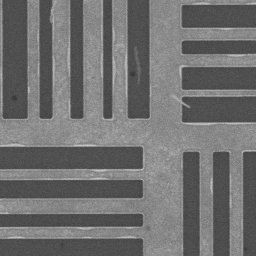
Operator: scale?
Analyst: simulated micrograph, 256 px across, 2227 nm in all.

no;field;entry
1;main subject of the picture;groups of lines, slits or small figures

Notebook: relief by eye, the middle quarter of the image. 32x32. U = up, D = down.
UDDDDUUUUDDDDUUUDDDDDDUUUUUUUUUU
UDDDDUUUUDDDDUUUDDDDDDUUUUUUUDDD
UDDDDUUUUDDDDUUUDDDDDDUUUUUUUDDD
UDDDDUUUUUDDUUUUDDDDDDUUUUUUUDDD
UDDDDUUUUUDDUUUUDDDDDDUUUUUUUDDD
UDDDDUUUUUDDUUUUDDDDDDUUUUUUUDDD
UDDDDUUUUUDDUUUUDDDDDDUUUUUUUUDD
UDDDDUUUUUDDUUUUDDDDDDUUUUUUUUUU
UDDDDUUUUUDDUUUUDDDDDDUUUUUUUDDD
UDDDDUUUUUDDUUUUDDDDDDUUUUUUUUDD
UDDDDUUUUUDDUUUUDDDDDDUUUUUUUDDD
UDDDDUUUUUDDUUUUDDDDDDUUUUUUUDDD
UDDDDUUUUUDDUUUUDDDDDDUUUUUUUDDD
UUDDDUUUUUDDUUUUDDDDDUUUUUUUUDDD
UUUUUUUUUUUUUUUUUUUUUUUUUUUUUUDD
UUUUUUUUUUUUUUUUUUUUUUUUUUUUUUUU
UUUUUUUUUUUUUUUUUUUUUUUUUUUUUUUU
UUUUUUUUUUUUUUUUUUUUUUUUUUUUUUUU
UUUUUUUUUUUUUUUUUUUUUUUUUUUUUUUU
UUUUUUUUUUUUUUUUUUUUUUUUUUUUUUUU
UUDDDDDDDDDDDDDDDDDUUUUUUUUUUUUU
DDDDDDDDDDDDDDDDDDDDUUUUUUUUUUUU
DDDDDDDDDDDDDDDDDDDDUUUUUUUUUDDD
DDDDDDDDDDDDDDDDDDDDUUUUUUUUUDDD
DDDDDDDDDDDDDDDDDDDDUUUUUUUUUDDD
DDDDDDDDDDDDDDDDDDDDUUUUUUUUUDDD
UUUUUUUDDDDUUUUUDDUUUUUUUUUUUDDD
UUUUUUUUUUUUUUUUUUUUUUUUUUUUUDDD
UUUUUUUUUUUUUUUUUUUUUUUUUUUUUDDD
DDDDDDDDDDDDDDDDDDDDUUUUUUUUUDDD
DDDDDDDDDDDDDDDDDDDDUUUUUUUUUDDD
DDDDDDDDDDDDDDDDDDDDUUUUUUUUUDDD